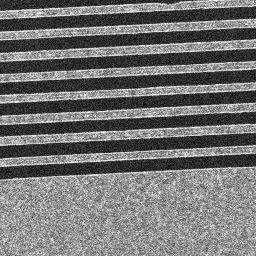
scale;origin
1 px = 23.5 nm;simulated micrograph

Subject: parallel lines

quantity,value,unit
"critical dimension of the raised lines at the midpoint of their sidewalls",170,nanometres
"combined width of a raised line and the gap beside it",494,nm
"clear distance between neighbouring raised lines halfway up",320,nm